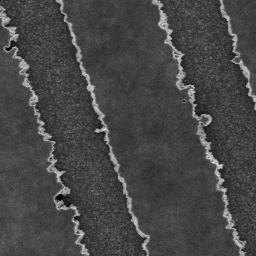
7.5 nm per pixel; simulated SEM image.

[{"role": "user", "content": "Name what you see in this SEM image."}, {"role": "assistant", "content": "one or a few lines or trenches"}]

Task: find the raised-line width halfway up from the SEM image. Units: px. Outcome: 92.5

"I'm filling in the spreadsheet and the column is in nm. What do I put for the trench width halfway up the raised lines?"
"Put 432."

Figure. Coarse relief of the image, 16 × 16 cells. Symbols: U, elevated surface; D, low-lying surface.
DDDDUUUUUUDDDDUU
DDDDUUUUUUDDDDUU
UDDDDUUUUUUDDDDU
UDDDDUUUUUUDDDDU
UUDDDUUUUUUDDDDU
UUDDDDUUUUUUDDDD
UUDDDDUUUUUUDDDD
UUDDDDUUUUUUUDDD
UUUDDDDUUUUUUDDD
UUUDDDDUUUUUUDDD
UUUDDDDUUUUUUUDD
UUUUDDDDUUUUUUDD
UUUUDDDDUUUUUUDD
UUUUUDDDUUUUUUDD
UUUUUDDDDUUUUUUD
UUUUUDDDDUUUUUUD